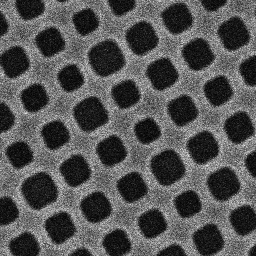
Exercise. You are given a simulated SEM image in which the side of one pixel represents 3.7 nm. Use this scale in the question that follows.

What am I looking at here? a regular array of holes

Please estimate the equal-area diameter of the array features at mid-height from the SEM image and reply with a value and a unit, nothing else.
115 nanometers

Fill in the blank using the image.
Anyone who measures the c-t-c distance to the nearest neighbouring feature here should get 0.151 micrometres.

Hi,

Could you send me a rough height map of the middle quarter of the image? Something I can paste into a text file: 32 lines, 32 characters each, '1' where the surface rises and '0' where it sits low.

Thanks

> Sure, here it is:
00011110000000011111100000001110
00001110000000111111000000001111
00000111000001111111000000000111
00000111111111111111100000000111
00000111111111000011100000001111
00001111111100000011110000011111
00011111111100000001111001111111
11111111111100000001111111111111
11111100011100000001111111110000
11110000001110000001111111000000
11100000001110000111111111000000
11000000000111111111111111000000
11000000000111111111111111000000
11000000000111111111001111100000
11100000000111111100000111100000
01110000001111111000000011110011
01110000111111111000000011111111
00111111111111111100000011111111
00111111110000111100000011111110
01111111100000011110001111111110
11111111000000011111111111111100
11111111000000001111111110001110
11101111000000001111111000001110
10000111100000011111110000000111
00000011100000111111100000000011
00000011110001111111100000000011
00000001111111111111110000000001
00000001111111100001110000000011
00000011111111000000111000000011
00000011111110000000111000001111
10001111111110000000011100111111
11111111111110000000011111111110